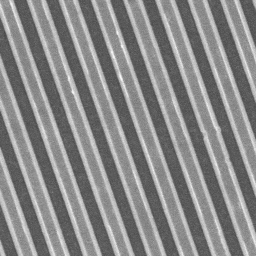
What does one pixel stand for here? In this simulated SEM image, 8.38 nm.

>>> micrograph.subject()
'parallel lines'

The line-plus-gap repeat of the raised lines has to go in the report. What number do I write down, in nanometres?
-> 255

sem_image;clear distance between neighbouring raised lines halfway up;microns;0.133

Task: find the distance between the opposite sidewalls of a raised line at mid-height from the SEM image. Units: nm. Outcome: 118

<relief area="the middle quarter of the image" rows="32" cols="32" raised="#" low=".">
#....####....####....####....###
#....####....####....####....###
#.....###.....###.....####....##
##....####....####....####....##
##....####....####....####....##
##.....###.....###.....####....#
###....####....####....####....#
###....####....####....####....#
###.....###.....###.....####....
####....####....####....####....
####....####....####....####....
.###.....###.....###.....####...
.####....####....####....####...
.####....####....####.....###...
..###.....####....####....####..
..####....####....####....####..
..####....####.....###....####..
...####....###.....####....####.
...####....####....####....####.
...####....####.....###....####.
....####....####....####....####
....####....####....####....####
.....###....####.....###.....###
.....####....####....####....###
#....####....####....####....###
#.....###....####.....###.....##
#.....####....####....####....##
##....####....####....####....##
##.....###.....###.....###.....#
###....####....####....####....#
###....####....####....####....#
###.....###.....###.....###.....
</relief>